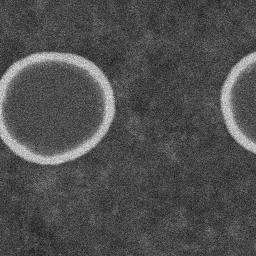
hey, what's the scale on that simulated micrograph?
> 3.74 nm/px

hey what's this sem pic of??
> raised bodies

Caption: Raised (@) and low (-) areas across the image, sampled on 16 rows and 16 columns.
----------------
----------------
----------------
---@------------
-@@@@@---------@
@@@@@@@-------@@
@@@@@@@-------@@
@@@@@@@-------@@
@@@@@@---------@
-@@@@-----------
----------------
----------------
----------------
----------------
----------------
----------------